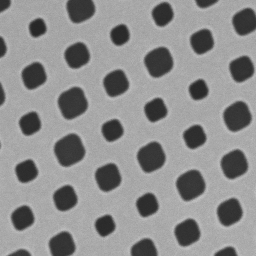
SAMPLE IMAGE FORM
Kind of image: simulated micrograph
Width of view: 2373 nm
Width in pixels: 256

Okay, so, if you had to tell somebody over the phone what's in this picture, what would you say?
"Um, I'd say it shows a regular array of holes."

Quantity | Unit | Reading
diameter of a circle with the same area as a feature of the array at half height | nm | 241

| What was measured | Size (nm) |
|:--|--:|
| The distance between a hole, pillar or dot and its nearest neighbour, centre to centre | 439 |